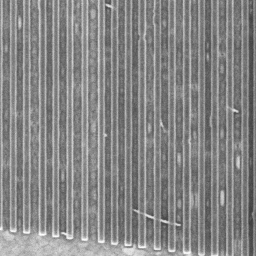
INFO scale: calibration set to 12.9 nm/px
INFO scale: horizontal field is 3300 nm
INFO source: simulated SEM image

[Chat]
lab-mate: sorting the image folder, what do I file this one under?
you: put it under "parallel lines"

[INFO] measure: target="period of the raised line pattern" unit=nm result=187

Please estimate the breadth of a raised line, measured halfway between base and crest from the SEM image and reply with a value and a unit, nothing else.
82.2 nm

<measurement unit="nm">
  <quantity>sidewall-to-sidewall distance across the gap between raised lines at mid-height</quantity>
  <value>106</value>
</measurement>